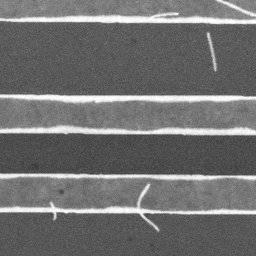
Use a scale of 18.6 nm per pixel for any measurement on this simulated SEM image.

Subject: lines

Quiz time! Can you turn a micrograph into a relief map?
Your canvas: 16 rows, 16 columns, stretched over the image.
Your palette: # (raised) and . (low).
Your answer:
################
................
................
................
................
................
################
################
................
................
................
################
################
................
................
................